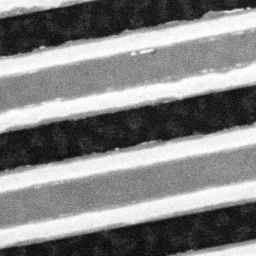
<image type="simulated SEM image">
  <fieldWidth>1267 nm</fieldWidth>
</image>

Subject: one or a few lines or trenches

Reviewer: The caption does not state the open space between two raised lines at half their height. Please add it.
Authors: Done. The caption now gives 60.9 pixels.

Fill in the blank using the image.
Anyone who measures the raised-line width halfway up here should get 262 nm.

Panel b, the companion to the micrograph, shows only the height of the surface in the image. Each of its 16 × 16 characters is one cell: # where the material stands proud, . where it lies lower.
................
..............##
.........#######
....############
################
###########.....
######..........
................
................
...........#####
.....###########
################
############....
#######.........
##..............
................